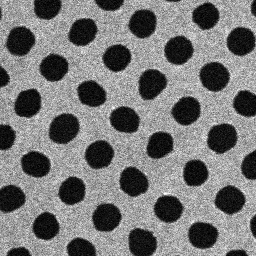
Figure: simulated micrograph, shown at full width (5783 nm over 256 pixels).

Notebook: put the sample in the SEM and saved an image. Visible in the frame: a regular array of holes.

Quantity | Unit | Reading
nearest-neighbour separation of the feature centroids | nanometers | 983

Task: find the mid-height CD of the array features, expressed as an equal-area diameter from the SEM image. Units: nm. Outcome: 659